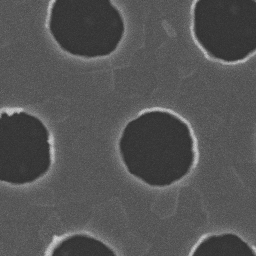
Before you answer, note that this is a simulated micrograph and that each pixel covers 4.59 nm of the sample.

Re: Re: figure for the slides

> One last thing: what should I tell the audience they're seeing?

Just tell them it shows holes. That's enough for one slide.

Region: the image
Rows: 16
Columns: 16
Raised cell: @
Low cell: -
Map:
@@@----@@@@@----
@@@-----@@@@----
@@@-----@@@@----
@@@@@-@@@@@@@--@
@@@@@@@@@@@@@@@@
@@@@@@@@@@@@@@@@
@@@@@@@@@@@@@@@@
--@@@@@@---@@@@@
---@@@@@----@@@@
---@@@@@----@@@@
---@@@@@----@@@@
@@@@@@@@@--@@@@@
@@@@@@@@@@@@@@@@
@@@@@@@@@@@@@@@@
@@@@@@@@@@@@@@@@
@@@@---@@@@@----